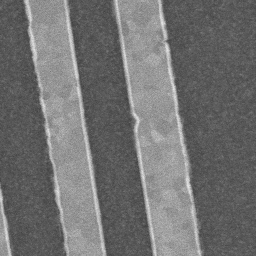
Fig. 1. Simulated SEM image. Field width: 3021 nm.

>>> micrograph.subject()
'one or a few lines or trenches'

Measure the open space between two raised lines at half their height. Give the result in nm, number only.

605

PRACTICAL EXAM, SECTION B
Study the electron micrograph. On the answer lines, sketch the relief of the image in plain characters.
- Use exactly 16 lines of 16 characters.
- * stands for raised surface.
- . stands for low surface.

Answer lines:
..**...***......
..**...***......
..**....**......
..***...**......
..***...***.....
...**...***.....
...**...***.....
...**....**.....
...**....**.....
...**....**.....
...***...***....
....**...***....
....**...***....
....**...***....
....**....**....
*...**....**....